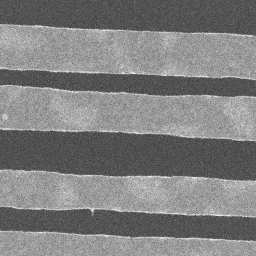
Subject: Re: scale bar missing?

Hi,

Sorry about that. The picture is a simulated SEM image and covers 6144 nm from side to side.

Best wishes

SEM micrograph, one or a few lines or trenches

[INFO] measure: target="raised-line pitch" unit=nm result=1700